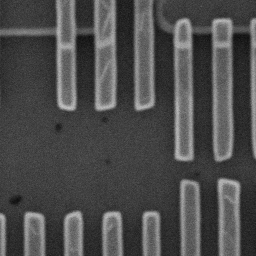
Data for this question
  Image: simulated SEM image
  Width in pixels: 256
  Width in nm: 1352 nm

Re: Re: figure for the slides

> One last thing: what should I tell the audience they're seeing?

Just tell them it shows wiring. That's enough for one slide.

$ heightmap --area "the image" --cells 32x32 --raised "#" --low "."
##############...##.############
##############...##.############
##############...##.############
##############...##..###########
.......##...##...##...##...##..#
.......##...##...##...##...##..#
.......##...##...##...##...##...
.......##...##...##...##...##...
.......##...##...##...##...##...
.......##...##...##...##...##...
.......##...##...##...##...##...
.......##...##...##...##...##...
.......##...##...##...##...##...
......................##...##...
......................##...##...
......................##...##...
......................##...##...
......................##...##...
......................##...##...
......................##...#....
................................
................................
................................
.......................##..###..
.......................##...##..
.......................##...##..
.......................##...##..
...##...##...##...##...##...##..
...##...##...##...##...##...##..
...##...##...##...##...##...##..
...##...##...##...##...##...##..
...##...##...##...##...##...##..